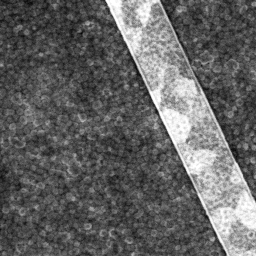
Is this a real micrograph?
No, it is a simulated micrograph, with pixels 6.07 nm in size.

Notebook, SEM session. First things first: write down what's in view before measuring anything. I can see one or a few lines or trenches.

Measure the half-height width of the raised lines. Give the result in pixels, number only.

46.6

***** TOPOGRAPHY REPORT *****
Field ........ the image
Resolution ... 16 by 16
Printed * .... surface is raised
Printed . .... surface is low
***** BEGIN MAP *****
.......***......
.......****.....
........***.....
........****....
.........***....
.........****...
..........***...
..........***...
...........***..
...........***..
............***.
............***.
.............***
.............***
..............**
..............**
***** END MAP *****